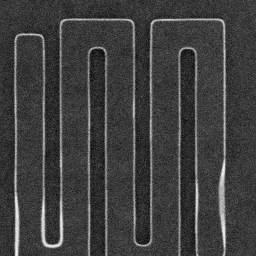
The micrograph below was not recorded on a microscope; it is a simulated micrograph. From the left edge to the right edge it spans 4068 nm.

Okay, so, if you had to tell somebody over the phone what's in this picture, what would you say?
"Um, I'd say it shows groups of lines, slits or small figures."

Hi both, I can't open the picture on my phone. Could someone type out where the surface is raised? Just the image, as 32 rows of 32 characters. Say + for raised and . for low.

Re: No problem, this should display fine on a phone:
................................
................................
................................
........+++++++++..+++++++++....
..+++...+++++++++..+++++++++....
..+++...+++++++++..+++++++++....
..+++...+++..++++..++++.++++....
..+++...+++..++++..+++...+++....
..+++...+++..++++..+++...+++....
..+++...+++..++++..+++...+++....
..+++...+++..++++..+++...+++....
..+++...+++..++++..+++...+++....
..+++...+++..++++..+++...+++....
..+++...+++..++++..+++...+++....
..+++...+++..++++..+++...+++....
..+++...+++..++++..+++...+++....
..+++...+++..++++..+++...+++....
..+++...+++..++++..+++...+++....
..+++...+++..++++..+++...+++....
..+++...+++..++++..+++...+++....
..+++...+++..++++..+++...+++....
..+++...+++..++++..+++...+++....
..+++...+++..++++..+++...+++....
..+++...+++..++++..+++...+++....
..+++...+++..++++..+++...+++....
..+++...+++..++++..+++...+++....
..+++...+++..++++..+++...+++....
..+++...+++..++++..+++...+++....
..+++...+++..++++..+++...+++....
..+++...+++..++++..+++...+++....
..++++.++++..++++.++++...+++....
..+++++++++..+++++++++...+++....